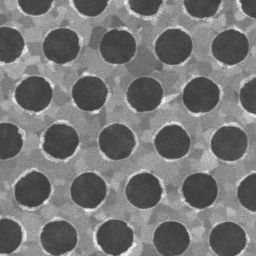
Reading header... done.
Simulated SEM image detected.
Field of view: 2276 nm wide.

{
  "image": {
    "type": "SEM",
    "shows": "a regular array of holes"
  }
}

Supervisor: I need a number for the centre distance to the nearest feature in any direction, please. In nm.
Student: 490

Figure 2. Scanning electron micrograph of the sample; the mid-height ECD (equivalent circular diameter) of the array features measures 324 nm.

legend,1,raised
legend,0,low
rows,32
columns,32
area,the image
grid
11000011100001110000111000001100
11100011110001111000111000011100
11111111111111111111111111111111
00111111111111111111111111111111
00011100001110000111000011100001
00011000001110000110000011000001
00011000001110000110000011100001
00111100011110001111000111100011
11111111111111111111111111111111
11111111111111111111111111111111
11000011100001110000111000011110
11000001100001110000111000011100
11000011100001110000111000011100
11100011110001111000111000011110
11111111111111111111111111111111
00111110111111011111111111111111
00111100001110000111000111100001
00011000001100000110000011000001
00011000001100000110000011000001
00111100011110001111000111100011
11111111111111111111111111111111
11110111111111111111111111111111
11000011100001110000111000011100
11000011100001110000111000011100
11000011100001110000111000011100
11100111100011110000111100111100
11111111111111111111111111111111
00111111111111011111111111111111
00011000011100001111000111100011
00011000001100000110000011000001
00011000001100000110000011000001
00111100011110001111000111100011